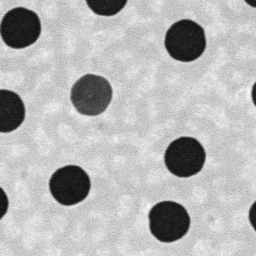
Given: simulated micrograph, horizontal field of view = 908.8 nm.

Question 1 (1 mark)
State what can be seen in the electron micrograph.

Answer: holes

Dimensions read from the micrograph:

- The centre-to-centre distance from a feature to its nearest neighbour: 330 nm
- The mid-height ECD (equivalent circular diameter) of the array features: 42.2 pixels